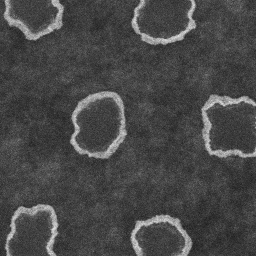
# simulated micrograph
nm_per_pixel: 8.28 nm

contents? raised bodies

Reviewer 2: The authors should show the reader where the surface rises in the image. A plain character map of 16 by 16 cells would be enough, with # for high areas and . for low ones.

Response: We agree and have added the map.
####.....###....
.##.....####....
.........##.....
................
................
................
.....###.....###
.....###.....###
.....###.....###
.....##......###
................
................
................
.##.............
.##.....###.....
###......###....